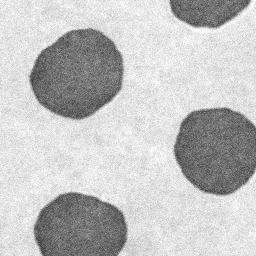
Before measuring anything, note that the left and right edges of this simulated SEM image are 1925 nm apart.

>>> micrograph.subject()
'holes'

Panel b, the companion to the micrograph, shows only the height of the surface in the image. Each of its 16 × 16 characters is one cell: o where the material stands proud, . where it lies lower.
ooooooooooo....o
oooooooooooo..oo
oooo...ooooooooo
oo......oooooooo
oo......oooooooo
oo......oooooooo
ooo....ooooooooo
ooooooooooo.....
ooooooooooo.....
ooooooooooo.....
ooooooooooo.....
oooooooooooo...o
ooo...oooooooooo
oo......oooooooo
oo......oooooooo
oo......oooooooo